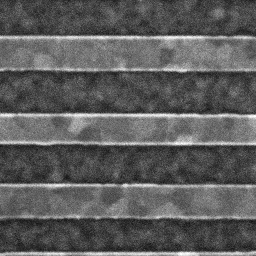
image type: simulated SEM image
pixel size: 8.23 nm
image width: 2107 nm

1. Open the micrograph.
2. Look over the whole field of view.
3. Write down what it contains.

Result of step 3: lines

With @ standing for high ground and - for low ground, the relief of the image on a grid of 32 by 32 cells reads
--------------------------------
--------------------------------
--------------------------------
--------------------------------
--------------------------------
@@@@@@@@@@@@@@@@@@@@@@@@@@@@@@@@
@@@@@@@@@@@@@@@@@@@@@@@@@@@@@@@@
@@@@@@@@@@@@@@@@@@@@@@@@@@@@@@@@
@@@@@@@@@@@@@@@@@@@@@@@@@@@@@@@@
--------------------------------
--------------------------------
--------------------------------
--------------------------------
--------------------------------
@@@@@@@@@@@@@@@@@@@@@@@@@@@@@@@@
@@@@@@@@@@@@@@@@@@@@@@@@@@@@@@@@
@@@@@@@@@@@@@@@@@@@@@@@@@@@@@@@@
@@@@@@@@@@@@@@@@@@@@@@@@@@@@@@@@
--------------------------------
--------------------------------
--------------------------------
--------------------------------
--------------------------------
@@@@@@@@@@@@@@@@@@@@@@@@@@@@@@@@
@@@@@@@@@@@@@@@@@@@@@@@@@@@@@@@@
@@@@@@@@@@@@@@@@@@@@@@@@@@@@@@@@
@@@@@@@@@@@@@@@@@@@@@@@@@@@@@@@@
--------------------------------
--------------------------------
--------------------------------
--------------------------------
--------------------------------